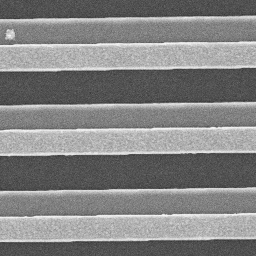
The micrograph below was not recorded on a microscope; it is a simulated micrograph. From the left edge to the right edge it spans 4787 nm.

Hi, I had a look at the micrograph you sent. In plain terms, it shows lines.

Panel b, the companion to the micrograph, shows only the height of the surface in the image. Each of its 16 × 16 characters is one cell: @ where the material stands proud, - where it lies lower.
----------------
@@@@@@@@@@@@@@@@
@@@@@@@@@@@@@@@@
@@@@@@@@@@@@@@@@
----------------
----------------
-----------@@@@@
@@@@@@@@@@@@@@@@
@@@@@@@@@@@@@@@@
@@@@@@@@@@@@@@@-
----------------
----------------
@@@@@@@@@@@@@@@@
@@@@@@@@@@@@@@@@
@@@@@@@@@@@@@@@@
----------------